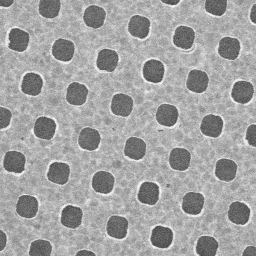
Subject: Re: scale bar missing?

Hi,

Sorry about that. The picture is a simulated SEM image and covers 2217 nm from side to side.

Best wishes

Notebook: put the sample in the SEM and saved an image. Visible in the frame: a regular array of holes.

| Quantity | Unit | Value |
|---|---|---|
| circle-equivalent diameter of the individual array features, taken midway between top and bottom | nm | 204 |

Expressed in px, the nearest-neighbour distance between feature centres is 45.5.